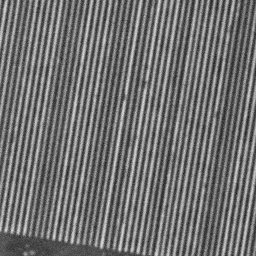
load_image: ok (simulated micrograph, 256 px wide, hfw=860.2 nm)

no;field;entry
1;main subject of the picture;parallel lines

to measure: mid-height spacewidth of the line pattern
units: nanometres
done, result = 14.9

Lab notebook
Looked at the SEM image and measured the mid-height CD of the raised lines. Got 0.0058 µm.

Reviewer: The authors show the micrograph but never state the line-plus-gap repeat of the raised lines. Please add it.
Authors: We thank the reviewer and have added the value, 20.3 nm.